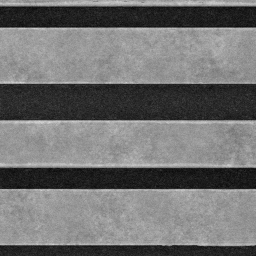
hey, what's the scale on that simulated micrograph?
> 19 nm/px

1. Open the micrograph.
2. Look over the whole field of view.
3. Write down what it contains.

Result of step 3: lines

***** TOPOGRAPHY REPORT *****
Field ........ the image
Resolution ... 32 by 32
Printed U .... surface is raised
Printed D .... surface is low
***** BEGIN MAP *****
UUUUUUUUUUUUUUUUUUUUUUUUUUUUUUUU
DDDDDDDDDDDDDDDDDDDDDDDDDDDDDDDD
DDDDDDDDDDDDDDDDDDDDDDDDDDDDDDDD
DDDDDDDDDDDDDDDDDDDDDDDDDDDDDDDD
UUUUUUUUUUUUUUUUUUUUUUUUUUUUUUUU
UUUUUUUUUUUUUUUUUUUUUUUUUUUUUUUU
UUUUUUUUUUUUUUUUUUUUUUUUUUUUUUUU
UUUUUUUUUUUUUUUUUUUUUUUUUUUUUUUU
UUUUUUUUUUUUUUUUUUUUUUUUUUUUUUUU
UUUUUUUUUUUUUUUUUUUUUUUUUUUUUUUU
DDDDDDDDDDDDDDDDDDDDDDDDDDDDDDDD
DDDDDDDDDDDDDDDDDDDDDDDDDDDDDDDD
DDDDDDDDDDDDDDDDDDDDDDDDDDDDDDDD
DDDDDDDDDDDDDDDDDDDDDDDDDDDDDDDD
DDDDDDDDDDDDDDDDDDDDDDDDDDDDDDDD
UUUUUUUUUUUUUUUUUUUUUUUUUUUUUUUU
UUUUUUUUUUUUUUUUUUUUUUUUUUUUUUUU
UUUUUUUUUUUUUUUUUUUUUUUUUUUUUUUU
UUUUUUUUUUUUUUUUUUUUUUUUUUUUUUUU
UUUUUUUUUUUUUUUUUUUUUUUUUUUUUUUU
UUUUUUUUUUUUUUUUUUUUUUUUUUUUUUUU
DDDDDDDDDDDDDDDDDDDDDDDDDDDDDDDD
DDDDDDDDDDDDDDDDDDDDDDDDDDDDDDDD
DDDDDDDDDDDDDDDDDDDDDDDDDDDDDDDD
UUUUUUUUUUUUUUUUUUUUUUUUUUUUUUUU
UUUUUUUUUUUUUUUUUUUUUUUUUUUUUUUU
UUUUUUUUUUUUUUUUUUUUUUUUUUUUUUUU
UUUUUUUUUUUUUUUUUUUUUUUUUUUUUUUU
UUUUUUUUUUUUUUUUUUUUUUUUUUUUUUUU
UUUUUUUUUUUUUUUUUUUUUUUUUUUUUUUU
UUUUUUUUUUUUUUUUUUUUUUUUUUUUUUUU
DDDDDDDDDDDDDDDDDDDDDDDDDDDDDDDD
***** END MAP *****